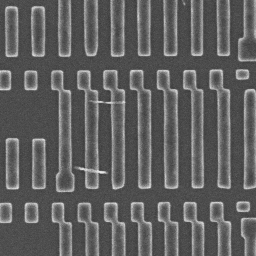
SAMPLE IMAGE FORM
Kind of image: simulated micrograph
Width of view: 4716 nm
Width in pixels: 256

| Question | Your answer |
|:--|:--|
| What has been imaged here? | wiring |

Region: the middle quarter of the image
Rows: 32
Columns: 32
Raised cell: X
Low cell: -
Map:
--------------------------------
--------------------------------
----XX----XXX----XXX---XXX----XX
----XX----XXX----XXX---XXX----XX
----XX----XXX----XXX---XXX----XX
----XX----XXX----XXX---XXX----XX
-----XX----XXXX---XXX----XXX---X
XX---XXX----XXX---XXXX---XXX----
XX---XXX----XXX----XXX---XXX----
XX---XXXX--XXXX----XXX---XXX----
XX---XXX----XXX----XXX---XXX----
XX---XXX----XXX----XXX---XXX----
XX---XXX----XXX----XXX---XXX----
XX---XXX----XXX----XXX---XXX----
XX---XXX----XXX----XXX---XXX----
XX---XXX----XXX----XXX---XXX----
XX---XXX----XXX----XXX---XXX----
XX---XXX----XXX----XXX---XXX----
XX---XXX----XXX----XXX---XXX----
XX---XXX----XXX----XXX---XXX----
XX---XXX----XXX----XXX---XXX----
XX---XXX----XXX----XXX---XXX----
XX---XXX----XXX----XXX---XXX----
XX---XXX----XXX----XXX---XXX----
XX---XXX----XXX----XXX---XXX----
XX---XXX----XXX----XXX---XXX----
XX---XXXX---XXX----XXX---XXX----
XX---XXXX---XXX----XXX---XXX----
XX---XXX----XXX----XXX---XXX----
XX---XXX----XXX----XXX---XXX----
XX---XXX----XXX----XXX---XXX----
XX------------------------------